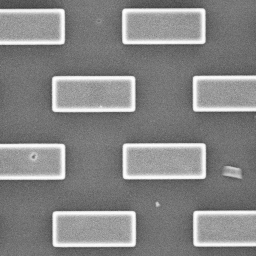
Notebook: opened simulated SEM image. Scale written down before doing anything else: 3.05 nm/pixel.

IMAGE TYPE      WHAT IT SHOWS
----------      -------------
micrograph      groups of lines, slits or small figures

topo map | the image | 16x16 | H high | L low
LLLLLLLLLLLLLLLL
HHHHLLLLHHHHHLLL
HHHHLLLLHHHHHLLL
LLLLLLLLLLLLLLLL
LLLLLLLLLLLLLLLL
LLLHHHHHLLLLHHHH
LLLHHHHHLLLLHHHH
LLLLLLLLLLLLLLLL
LLLLLLLLLLLLLLLL
HHHHLLLLHHHHHLLL
HHHHLLLLHHHHHLLL
LLLLLLLLLLLLLLLL
LLLLLLLLLLLLLLLL
LLLLHHHHLLLLHHHH
LLLHHHHHLLLLHHHH
LLLLLLLLLLLLLLLL